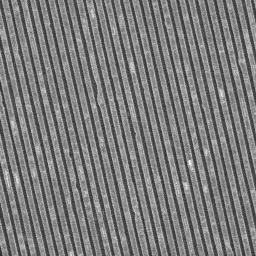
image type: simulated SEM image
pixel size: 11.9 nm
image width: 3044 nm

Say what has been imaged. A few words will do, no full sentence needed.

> parallel lines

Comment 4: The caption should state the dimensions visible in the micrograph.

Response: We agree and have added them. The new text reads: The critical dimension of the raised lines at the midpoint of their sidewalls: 63.1 nm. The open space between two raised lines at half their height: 42.1 nm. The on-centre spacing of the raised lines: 108 nm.